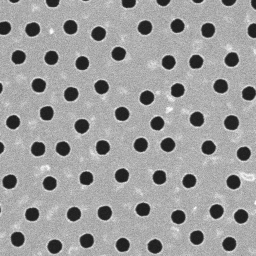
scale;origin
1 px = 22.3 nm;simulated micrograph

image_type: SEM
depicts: a regular array of holes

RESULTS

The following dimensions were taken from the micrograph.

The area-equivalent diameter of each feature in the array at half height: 334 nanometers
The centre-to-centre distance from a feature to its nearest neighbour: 669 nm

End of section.